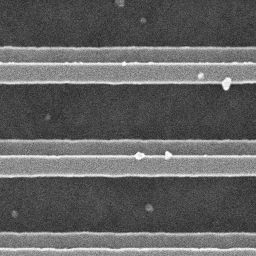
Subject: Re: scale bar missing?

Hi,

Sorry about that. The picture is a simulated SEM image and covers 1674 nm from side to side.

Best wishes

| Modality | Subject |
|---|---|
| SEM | lines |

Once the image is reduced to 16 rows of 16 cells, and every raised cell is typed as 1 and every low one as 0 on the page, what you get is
0000000000000000
0000000000000000
0000000000000000
1111111111111111
1111111111111111
0000000000000000
0000000000000000
0000000000000000
0000000000000000
1111111111111111
1111111111111111
0000000000000000
0000000000000000
0000000000000000
0000000000000000
1111111111111111